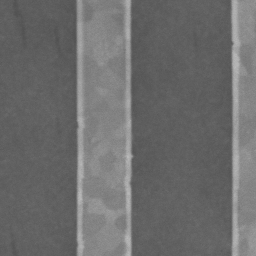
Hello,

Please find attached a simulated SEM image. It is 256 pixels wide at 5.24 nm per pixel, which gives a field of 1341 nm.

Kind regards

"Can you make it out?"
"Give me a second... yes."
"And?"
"one or a few lines or trenches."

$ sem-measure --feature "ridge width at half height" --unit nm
257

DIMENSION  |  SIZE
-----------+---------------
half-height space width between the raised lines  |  557 nm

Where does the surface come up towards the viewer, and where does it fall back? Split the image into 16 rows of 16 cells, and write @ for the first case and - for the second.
-----@@@-------@
-----@@@-------@
-----@@@-------@
-----@@@-------@
-----@@@-------@
-----@@@-------@
-----@@@-------@
-----@@@-------@
-----@@@-------@
-----@@@-------@
-----@@@-------@
-----@@@-------@
-----@@@-------@
-----@@@-------@
-----@@@-------@
-----@@@-------@